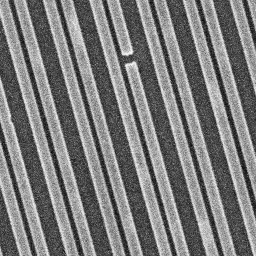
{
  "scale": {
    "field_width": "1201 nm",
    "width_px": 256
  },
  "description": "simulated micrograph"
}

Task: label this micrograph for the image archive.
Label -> parallel lines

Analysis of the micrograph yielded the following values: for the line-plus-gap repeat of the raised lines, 105 nm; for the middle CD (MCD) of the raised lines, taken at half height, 50.9 nanometres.